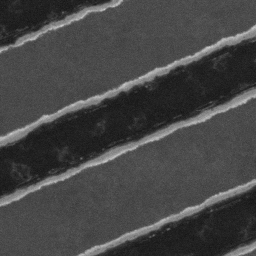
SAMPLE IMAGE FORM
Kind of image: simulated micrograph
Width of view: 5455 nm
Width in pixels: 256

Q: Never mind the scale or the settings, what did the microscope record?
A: one or a few lines or trenches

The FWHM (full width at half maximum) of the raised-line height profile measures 1750 nanometers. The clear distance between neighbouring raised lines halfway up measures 1.23 µm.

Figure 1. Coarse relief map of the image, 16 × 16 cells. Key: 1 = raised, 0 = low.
0000001111111111
0000111111111111
0011111111111110
1111111111110000
1111111111000000
1111111100000000
1111100000000011
1110000000001111
1000000000111111
0000000111111111
0000011111111111
0001111111111111
0111111111111000
1111111111100000
1111111110000000
1111110000000000